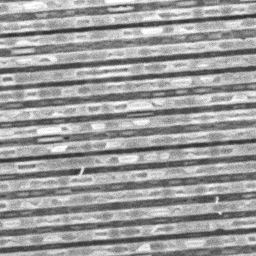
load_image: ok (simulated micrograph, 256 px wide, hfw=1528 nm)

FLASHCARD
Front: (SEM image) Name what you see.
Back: parallel lines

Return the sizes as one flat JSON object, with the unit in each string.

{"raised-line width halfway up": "62.5 nanometers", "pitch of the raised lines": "0.106 um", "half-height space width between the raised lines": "42.4 nm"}